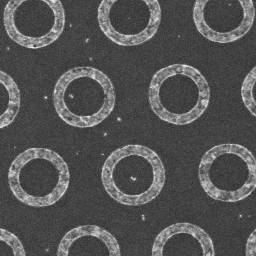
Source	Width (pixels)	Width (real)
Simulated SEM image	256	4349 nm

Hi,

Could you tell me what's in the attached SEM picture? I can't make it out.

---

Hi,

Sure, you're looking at ring-shaped raised bodies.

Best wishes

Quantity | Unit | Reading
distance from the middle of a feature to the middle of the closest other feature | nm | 1560